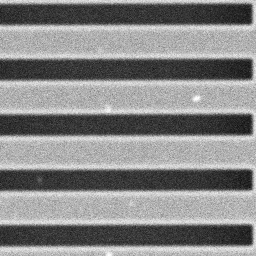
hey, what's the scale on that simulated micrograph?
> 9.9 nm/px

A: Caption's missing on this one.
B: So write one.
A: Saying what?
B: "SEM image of groups of lines, slits or small figures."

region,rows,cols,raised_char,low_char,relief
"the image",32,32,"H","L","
LLLLLLLLLLLLLLLLLLLLLLLLLLLLLLLH
LLLLLLLLLLLLLLLLLLLLLLLLLLLLLLLL
LLLLLLLLLLLLLLLLLLLLLLLLLLLLLLLL
HHHHHHHHHHHHHHHHHHHHHHHHHHHHHHHH
HHHHHHHHHHHHHHHHHHHHHHHHHHHHHHHH
HHHHHHHHHHHHHHHHHHHHHHHHHHHHHHHH
HHHHHHHHHHHHHHHHHHHHHHHHHHHHHHHH
LLLLLLLLLLLLLLLLLLLLLLLLLLLLLLLH
LLLLLLLLLLLLLLLLLLLLLLLLLLLLLLLL
LLLLLLLLLLLLLLLLLLLLLLLLLLLLLLLL
HHHHHHHHHHHHHHHHHHHHHHHHHHHHHHHH
HHHHHHHHHHHHHHHHHHHHHHHHHHHHHHHH
HHHHHHHHHHHHHHHHHHHHHHHHHHHHHHHH
HHHHHHHHHHHHHHHHHHHHHHHHHHHHHHHH
LLLLLLLLLLLLLLLLLLLLLLLLLLLLLLLL
LLLLLLLLLLLLLLLLLLLLLLLLLLLLLLLL
LLLLLLLLLLLLLLLLLLLLLLLLLLLLLLLL
HHHHHHHHHHHHHHHHHHHHHHHHHHHHHHHH
HHHHHHHHHHHHHHHHHHHHHHHHHHHHHHHH
HHHHHHHHHHHHHHHHHHHHHHHHHHHHHHHH
HHHHHHHHHHHHHHHHHHHHHHHHHHHHHHHH
LLLLLLLLLLLLLLLLLLLLLLLLLLLLLLLL
LLLLLLLLLLLLLLLLLLLLLLLLLLLLLLLL
LLLLLLLLLLLLLLLLLLLLLLLLLLLLLLLL
HHHHHHHHHHHHHHHHHHHHHHHHHHHHHHHH
HHHHHHHHHHHHHHHHHHHHHHHHHHHHHHHH
HHHHHHHHHHHHHHHHHHHHHHHHHHHHHHHH
HHHHHHHHHHHHHHHHHHHHHHHHHHHHHHHH
LLLLLLLLLLLLLLLLLLLLLLLLLLLLLLLL
LLLLLLLLLLLLLLLLLLLLLLLLLLLLLLLL
LLLLLLLLLLLLLLLLLLLLLLLLLLLLLLLL
HHHHHHHHHHHHHHHHHHHHHHHHHHHHHHHH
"